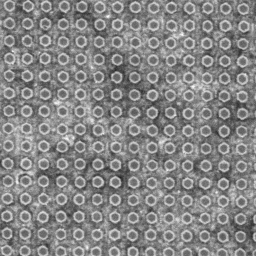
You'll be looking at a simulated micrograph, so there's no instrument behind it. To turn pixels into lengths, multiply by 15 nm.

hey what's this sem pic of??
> a regular array of raised bodies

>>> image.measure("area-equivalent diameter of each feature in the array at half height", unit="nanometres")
158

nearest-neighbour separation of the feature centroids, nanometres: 258